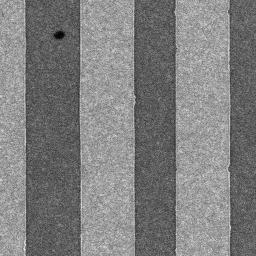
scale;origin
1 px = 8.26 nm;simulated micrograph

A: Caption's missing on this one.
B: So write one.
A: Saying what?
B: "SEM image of one or a few lines or trenches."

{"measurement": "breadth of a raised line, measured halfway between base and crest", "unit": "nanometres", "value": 440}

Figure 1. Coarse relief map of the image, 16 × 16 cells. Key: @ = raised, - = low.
@@---@@@---@@@--
@@---@@@---@@@--
@@---@@@---@@@--
@@---@@@---@@@--
@@---@@@---@@@--
@@---@@@---@@@--
@@---@@@---@@@--
@@---@@@---@@@--
@@---@@@---@@@--
@@---@@@---@@@--
@@---@@@---@@@--
@@---@@@---@@@--
@@---@@@---@@@--
@@---@@@---@@@--
@@---@@@---@@@--
@@---@@@---@@@--